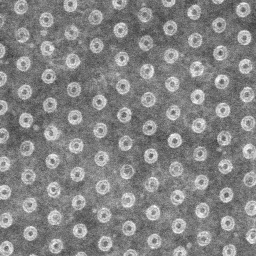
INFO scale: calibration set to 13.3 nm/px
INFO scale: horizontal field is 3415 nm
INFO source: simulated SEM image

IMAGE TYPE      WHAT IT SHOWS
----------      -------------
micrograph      a regular array of ring-shaped raised bodies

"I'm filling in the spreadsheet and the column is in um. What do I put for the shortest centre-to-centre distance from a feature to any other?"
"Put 0.375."